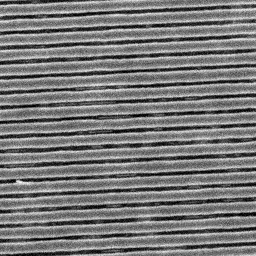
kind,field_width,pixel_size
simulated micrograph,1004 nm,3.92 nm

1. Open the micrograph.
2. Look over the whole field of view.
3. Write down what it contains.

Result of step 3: parallel lines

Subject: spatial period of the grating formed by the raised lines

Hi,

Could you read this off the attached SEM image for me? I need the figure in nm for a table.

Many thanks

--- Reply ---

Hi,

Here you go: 58.2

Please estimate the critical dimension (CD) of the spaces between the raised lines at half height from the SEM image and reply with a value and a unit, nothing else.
0.0181 micrometres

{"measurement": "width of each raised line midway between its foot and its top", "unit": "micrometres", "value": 0.0402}